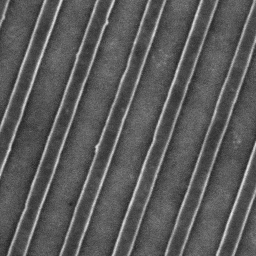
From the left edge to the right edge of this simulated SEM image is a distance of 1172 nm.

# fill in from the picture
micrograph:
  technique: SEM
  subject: parallel lines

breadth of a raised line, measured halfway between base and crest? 0.0709 µm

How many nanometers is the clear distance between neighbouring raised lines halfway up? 154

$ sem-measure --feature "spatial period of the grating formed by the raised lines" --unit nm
226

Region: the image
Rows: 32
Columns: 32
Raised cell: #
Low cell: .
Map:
#....##.....##....###....##.....
#....##.....##....##.....##....#
.....##....##.....##....##.....#
....##.....##....###....##.....#
....##.....##....##.....##....##
....##....##.....##....##.....##
...##.....##....##.....##.....#.
...##.....##....##.....##....##.
...##....##.....##....##.....##.
..##.....##....##.....##....###.
..##.....#.....##.....##....##..
..##....##.....##....##.....##..
.##.....##....##.....##....##...
.##.....#.....##....###....##...
.##....##.....##....##.....##...
##.....##....##.....##....##....
##....##.....##....##.....##....
##....##....###....##.....##....
#.....##....##.....##....##.....
#....##.....##....##.....##....#
#....##.....##....##.....##....#
.....##....##.....##....##.....#
....##.....##....##.....##....##
....##....###....##.....##....##
....##....##.....##....##.....##
...##.....##....##.....##....##.
...##....##.....##....###....##.
...##....##.....##....##.....##.
..##.....##....##.....##....##..
..##....##.....##....###....##..
.###....##.....##....##.....##..
.##.....##....##.....##....##...